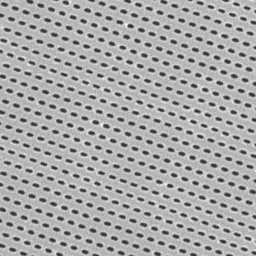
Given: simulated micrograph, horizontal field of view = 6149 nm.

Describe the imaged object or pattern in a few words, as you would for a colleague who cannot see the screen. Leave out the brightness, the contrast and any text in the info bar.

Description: a regular array of holes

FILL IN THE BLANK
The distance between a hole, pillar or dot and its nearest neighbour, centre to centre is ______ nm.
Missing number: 271